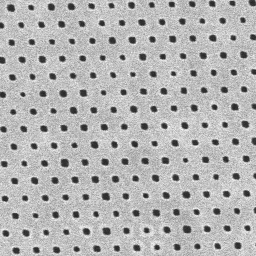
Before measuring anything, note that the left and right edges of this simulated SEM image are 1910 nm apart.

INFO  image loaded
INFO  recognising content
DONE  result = a regular array of holes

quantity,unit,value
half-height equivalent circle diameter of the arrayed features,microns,0.0512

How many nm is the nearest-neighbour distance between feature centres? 147